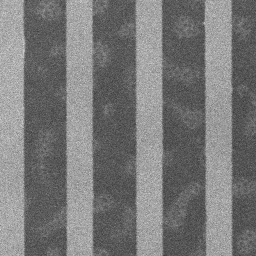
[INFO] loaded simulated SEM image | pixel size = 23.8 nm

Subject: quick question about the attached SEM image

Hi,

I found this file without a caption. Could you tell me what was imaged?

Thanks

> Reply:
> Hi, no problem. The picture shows one or a few lines or trenches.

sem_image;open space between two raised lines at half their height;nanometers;1050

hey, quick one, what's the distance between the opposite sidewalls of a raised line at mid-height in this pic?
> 598 nanometres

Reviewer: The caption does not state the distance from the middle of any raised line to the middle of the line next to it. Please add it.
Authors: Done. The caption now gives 1660 nm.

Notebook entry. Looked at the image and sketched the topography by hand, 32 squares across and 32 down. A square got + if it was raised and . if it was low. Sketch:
+++.....+++......+++......+++...
+++.....+++......+++......+++...
+++.....+++......+++......+++...
+++.....+++......+++......+++...
+++.....+++......+++......+++...
+++.....+++......+++......+++...
+++.....+++......+++......+++...
+++.....++++.....+++......+++...
+++.....++++.....+++......+++...
+++.....+++......+++......+++...
+++.....+++......+++......+++...
+++.....+++......+++......+++...
+++.....+++......+++......+++...
+++.....+++......+++......+++...
+++.....+++......+++......+++...
+++.....+++......+++......+++...
+++.....+++......+++......+++...
+++.....+++......+++......+++...
+++.....+++......+++......+++...
+++.....+++......+++......+++...
+++.....+++......+++......+++...
+++.....+++......+++......+++...
+++.....+++......+++......+++...
+++.....+++......+++......+++...
+++.....++++.....+++......+++...
+++.....++++.....+++......+++...
+++.....++++.....+++......+++...
+++.....++++.....+++......+++...
+++.....++++.....+++......+++...
+++.....++++.....+++......+++...
+++......+++.....+++......+++...
+++......+++.....+++......+++...